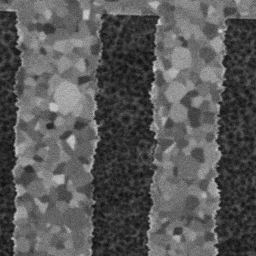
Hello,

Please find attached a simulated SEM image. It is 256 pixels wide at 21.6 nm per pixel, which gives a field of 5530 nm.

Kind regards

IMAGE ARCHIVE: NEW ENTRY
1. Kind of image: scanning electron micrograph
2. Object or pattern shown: one or a few lines or trenches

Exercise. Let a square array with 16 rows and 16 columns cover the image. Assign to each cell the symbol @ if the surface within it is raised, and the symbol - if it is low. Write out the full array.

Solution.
@@@@@@@@@@@@@@@@
-@@@@@----@@@@--
-@@@@@----@@@@--
-@@@@@----@@@@--
-@@@@@---@@@@@--
-@@@@@---@@@@@--
-@@@@@---@@@@@--
-@@@@@----@@@@--
-@@@@@----@@@@--
-@@@@@---@@@@@--
-@@@@@----@@@@--
-@@@@@---@@@@@--
-@@@@@---@@@@@--
-@@@@@---@@@@---
-@@@@@---@@@@---
-@@@@@---@@@@@--